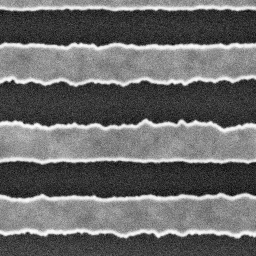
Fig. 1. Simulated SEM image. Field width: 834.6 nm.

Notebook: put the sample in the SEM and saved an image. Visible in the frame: lines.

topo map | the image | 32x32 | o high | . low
oooooooooooooooooooooooooooooooo
................................
................................
................................
................................
ooo.o....oo...o............o.o.o
oooooooooooooooooooooooooooooooo
oooooooooooooooooooooooooooooooo
oooooooooooooooooooooooooooooooo
oooooooooooooooooooooooooooooooo
.....o...oo....o....o...........
................................
................................
................................
................................
ooo..............oooooooooo.....
oooooooooooooooooooooooooooooooo
oooooooooooooooooooooooooooooooo
oooooooooooooooooooooooooooooooo
oooooooooooooooooooooooooooooooo
................................
................................
................................
................................
o....o...o........oo..oo.ooooooo
oooooooooooooooooooooooooooooooo
oooooooooooooooooooooooooooooooo
oooooooooooooooooooooooooooooooo
oooooooooooooooooooooooooooooooo
...............o.............o..
................................
................................